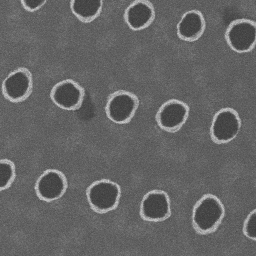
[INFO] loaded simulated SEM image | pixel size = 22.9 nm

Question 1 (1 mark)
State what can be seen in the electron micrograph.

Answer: a regular array of raised bodies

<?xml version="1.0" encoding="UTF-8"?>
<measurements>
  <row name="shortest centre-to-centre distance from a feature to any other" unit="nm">1210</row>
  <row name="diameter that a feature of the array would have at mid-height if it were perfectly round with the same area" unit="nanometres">672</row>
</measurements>